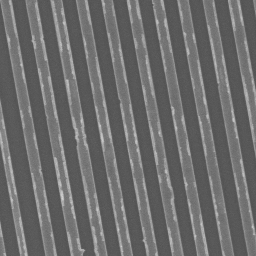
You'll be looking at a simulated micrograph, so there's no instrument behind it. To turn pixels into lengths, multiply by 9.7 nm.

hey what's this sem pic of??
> parallel lines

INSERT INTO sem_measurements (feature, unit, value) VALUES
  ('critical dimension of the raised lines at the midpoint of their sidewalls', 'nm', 105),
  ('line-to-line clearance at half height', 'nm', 140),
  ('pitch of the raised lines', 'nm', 243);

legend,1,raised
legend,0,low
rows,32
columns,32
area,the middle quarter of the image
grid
11000011100011100001100001110001
11000011100001100001110001110000
11100011100001100001110001110000
11100001100001110001110001110000
11100001100001110001110000110000
01100001110001110000110000110000
01100001110001110000110000111000
01100001110000110000111000111000
01110001110000110000111000111000
01110000110000111000111000011000
01110000110000111000011000011000
00110000111000111000011000011100
00110000111000011000011100011100
00111000111000011000011100011100
00111000111000011100011100011100
00111000011000011100011100001100
00011000011000011100001100001100
00011000011100011100001100001110
00011000011100001100001110001110
00011000011100001100001110001110
00011100001100001110001110001110
00011100001100001110000110000110
00001100001110001110000110000110
00001100001110001110000110000111
00001110001110000110000111000111
10001110001110000110000111000111
10001110000110000111000111000011
10001110000110000111000011000011
10000110000111000111000011000011
10000110000111000011000011100011
10000111000111000011000011100011
11000111000011000011100011100011